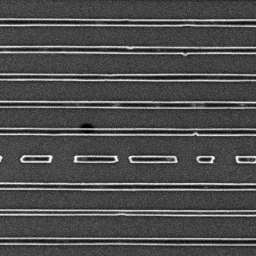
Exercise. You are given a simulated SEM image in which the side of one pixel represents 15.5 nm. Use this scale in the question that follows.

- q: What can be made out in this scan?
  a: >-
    parallel lines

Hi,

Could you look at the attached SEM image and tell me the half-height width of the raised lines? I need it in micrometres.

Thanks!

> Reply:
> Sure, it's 0.091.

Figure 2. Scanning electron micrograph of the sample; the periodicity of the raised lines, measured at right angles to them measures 423 nanometers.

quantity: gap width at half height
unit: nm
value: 331